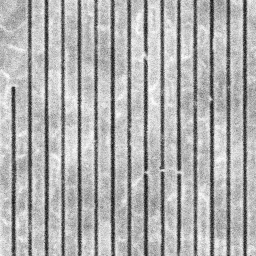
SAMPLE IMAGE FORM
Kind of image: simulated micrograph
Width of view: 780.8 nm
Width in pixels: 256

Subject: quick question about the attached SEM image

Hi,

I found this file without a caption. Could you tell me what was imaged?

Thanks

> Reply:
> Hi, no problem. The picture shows parallel lines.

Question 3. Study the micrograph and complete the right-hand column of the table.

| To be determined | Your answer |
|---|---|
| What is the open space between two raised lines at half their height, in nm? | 14.5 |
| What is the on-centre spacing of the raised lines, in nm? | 50.5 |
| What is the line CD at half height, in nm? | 37.4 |